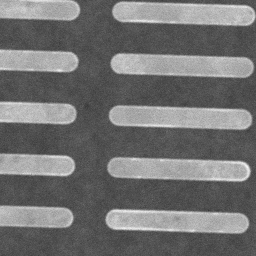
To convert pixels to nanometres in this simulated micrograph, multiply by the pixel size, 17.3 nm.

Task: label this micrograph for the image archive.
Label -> groups of lines, slits or small figures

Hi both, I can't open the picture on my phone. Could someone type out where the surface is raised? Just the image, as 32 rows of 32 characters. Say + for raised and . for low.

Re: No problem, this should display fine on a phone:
++++++++++.....+++++............
++++++++++....++++++++++++++++++
...............+++++++++++++++++
................................
................................
................................
++++++..........................
++++++++++....+++++++++++++++++.
+++++++++.....++++++++++++++++++
...........................++++.
................................
................................
................................
+++++++++.....+++++++++.........
+++++++++.....+++++++++++++++++.
..............+++++++++++++++++.
................................
................................
................................
+++++...........................
+++++++++.....++++++++++++++++..
+++++++++.....+++++++++++++++++.
................................
................................
................................
................................
+++++++++.....++++++++..........
+++++++++....++++++++++++++++++.
..............+++++++++++++++++.
................................
................................
................................